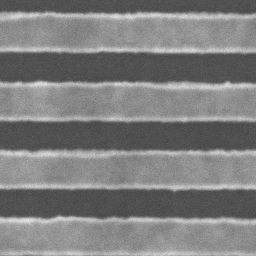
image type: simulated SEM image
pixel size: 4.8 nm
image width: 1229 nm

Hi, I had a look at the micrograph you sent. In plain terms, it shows lines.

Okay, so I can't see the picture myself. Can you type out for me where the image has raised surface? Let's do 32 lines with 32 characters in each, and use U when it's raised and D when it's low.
DDDDDDDDDDDDDDDDDDDDDDDDDDDDDDDD
DDDDDDDDDDDDDDDDDDDDDDDDDDDDDDDD
UUUUUUUUUUUUUUUUUUUUUUUUUUUUUUUU
UUUUUUUUUUUUUUUUUUUUUUUUUUUUUUUU
UUUUUUUUUUUUUUUUUUUUUUUUUUUUUUUU
UUUUUUUUUUUUUUUUUUUUUUUUUUUUUUUU
DDDDDDDDUUUUDDDDUDUUUUUUUUUUUUUU
DDDDDDDDDDDDDDDDDDDDDDDDDDDDDDDD
DDDDDDDDDDDDDDDDDDDDDDDDDDDDDDDD
DDDDDDDDDDDDDDDDDDDDDDDDDDDDDDDD
UUUUUUUUUUUUUUUUUUUUDUUUDDDDUUUU
UUUUUUUUUUUUUUUUUUUUUUUUUUUUUUUU
UUUUUUUUUUUUUUUUUUUUUUUUUUUUUUUU
UUUUUUUUUUUUUUUUUUUUUUUUUUUUUUUU
UUUUUUUUUUUUUUUUUUUUUUUUUUUUUUUU
DDDDDDDDDDDDDDDDDDDDDDDDDDDDDDDD
DDDDDDDDDDDDDDDDDDDDDDDDDDDDDDDD
DDDDDDDDDDDDDDDDDDDDDDDDDDDDDDDD
DDDDDDDDDDDDDDDDDDDDDDDDDDDDDDDD
UUUUUUUUUUUUUUUUUUUUUUUUUUUUUUUU
UUUUUUUUUUUUUUUUUUUUUUUUUUUUUUUU
UUUUUUUUUUUUUUUUUUUUUUUUUUUUUUUU
UUUUUUUUUUUUUUUUUUUUUUUUUUUUUUUU
UUUUUUUUUUUUUUUUUUUUUUUUUUUUUUUU
DDDDDDDDDDDDDDDDDDDDDDDDDDDDDDDD
DDDDDDDDDDDDDDDDDDDDDDDDDDDDDDDD
DDDDDDDDDDDDDDDDDDDDDDDDDDDDDDDD
UUUUUUUUUUUUUUUUUUUUUUUUUUUUUUDU
UUUUUUUUUUUUUUUUUUUUUUUUUUUUUUUU
UUUUUUUUUUUUUUUUUUUUUUUUUUUUUUUU
UUUUUUUUUUUUUUUUUUUUUUUUUUUUUUUU
UUUUUUUUUUUUUUUUUUUUUUUUUUUUUUUU